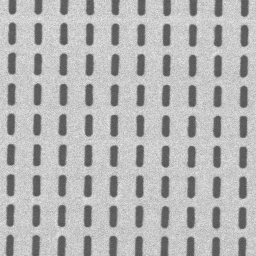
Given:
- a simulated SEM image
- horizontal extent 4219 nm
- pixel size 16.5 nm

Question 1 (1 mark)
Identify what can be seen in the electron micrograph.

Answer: a regular array of holes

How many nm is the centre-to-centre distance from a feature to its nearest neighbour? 421